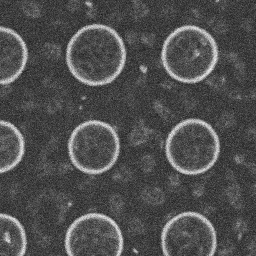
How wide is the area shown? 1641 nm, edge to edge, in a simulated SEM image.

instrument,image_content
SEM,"raised bodies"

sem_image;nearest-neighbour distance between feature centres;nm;592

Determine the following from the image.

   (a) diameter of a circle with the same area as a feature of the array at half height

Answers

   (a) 333 nm